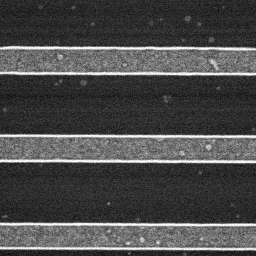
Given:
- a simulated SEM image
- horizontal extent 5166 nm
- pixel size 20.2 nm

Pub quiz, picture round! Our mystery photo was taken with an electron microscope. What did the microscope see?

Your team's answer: one or a few lines or trenches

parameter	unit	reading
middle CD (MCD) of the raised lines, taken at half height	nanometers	507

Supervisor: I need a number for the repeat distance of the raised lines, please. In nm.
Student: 1770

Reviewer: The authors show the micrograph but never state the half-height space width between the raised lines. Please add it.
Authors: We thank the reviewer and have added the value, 1280 nm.